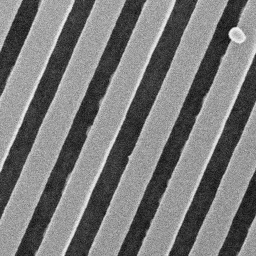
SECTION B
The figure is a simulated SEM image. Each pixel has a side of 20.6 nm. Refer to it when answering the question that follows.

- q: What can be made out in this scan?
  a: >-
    lines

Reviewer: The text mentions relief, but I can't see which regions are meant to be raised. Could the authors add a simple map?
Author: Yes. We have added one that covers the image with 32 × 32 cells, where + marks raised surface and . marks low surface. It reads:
+++..++++...+++...++++...+++...+
++...++++..++++...+++...++++..++
++..++++...++++..++++...+++...++
+...++++...+++...+++...++++..+++
+..++++...++++..++++...++++..+++
...++++...+++...++++..++++...+++
...+++...++++...+++...++++..++++
..++++...+++...++++...+++...+++.
..++++..++++...+++...++++..++++.
.++++...++++..++++...+++...++++.
.++++..++++...+++...++++...+++..
++++...++++..++++...++++..++++..
++++...+++...+++...++++...+++...
+++...++++..++++...++++..++++...
+++...+++...++++...+++...++++..+
+++..++++...+++...++++..++++...+
++...++++..++++...+++...++++..++
++..++++...+++...++++...+++...++
+...++++..++++...+++...++++..+++
+...+++...+++...++++...+++...+++
...++++..++++...++++..++++...+++
...+++...++++...+++...+++...++++
..++++...+++...++++..++++...+++.
..+++...++++...+++...++++..++++.
.++++...+++...++++..++++...+++..
.++++..++++...+++...++++...+++..
++++...+++...++++...+++...+++...
++++..++++...++++..++++...+++...
+++...++++..++++...+++...++++..+
+++...+++...++++..++++...+++...+
++...++++...+++...++++..++++..++
++...+++...++++..++++...+++...++